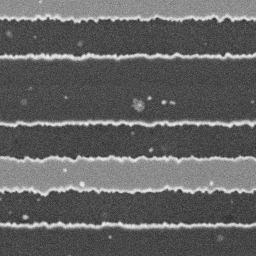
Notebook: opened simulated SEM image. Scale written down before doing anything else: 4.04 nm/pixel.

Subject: lines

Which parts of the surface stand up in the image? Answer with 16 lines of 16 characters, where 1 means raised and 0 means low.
1111111111111111
0000000000000000
0000000000000000
0000010011111011
1111111111111111
1111111111111111
1111111111111111
1111111111111111
0000000000000000
0000000000000000
1111111111111111
1111111111111111
0000000000000000
0000000000000000
1111111111111111
1111111111111111